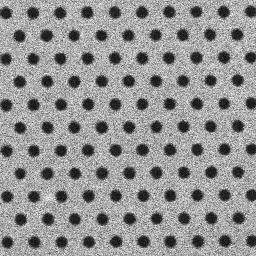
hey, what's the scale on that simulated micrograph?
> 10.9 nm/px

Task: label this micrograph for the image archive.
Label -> a regular array of holes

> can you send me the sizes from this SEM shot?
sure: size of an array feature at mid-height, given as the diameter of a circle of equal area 0.134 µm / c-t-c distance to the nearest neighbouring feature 289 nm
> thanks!